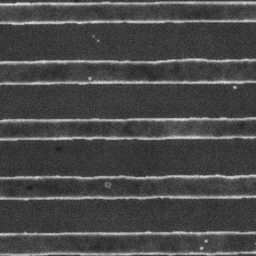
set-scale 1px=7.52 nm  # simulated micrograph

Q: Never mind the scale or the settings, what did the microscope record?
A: lines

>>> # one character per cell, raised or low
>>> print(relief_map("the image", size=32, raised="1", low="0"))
00001111000111111111111111111111
11111111111111111111111111111111
11111111111111111111111111111111
00000000000000000000000000000000
00000000000000000000000000000000
00000000000000000000000000000000
00000000000000000000000000000000
00000000000000000000001111000011
11111111111111111111111111111111
11111111111111111111111111111111
00000000000000000000000000000000
00000000000000000000000000000000
00000000000000000000000000000000
00000000000000000000000000000000
00000000000000000000000000000000
11111111111111111111111111111111
11111111111111111111111111111111
00000000000000000000000000000000
00000000000000000000000000000000
00000000000000000000000000000000
00000000000000000000000000000000
00000000000000000000000000000000
11111111111111111111111111111111
11111111111111111111111111111111
11111111111111111111111111111111
00000000000000000000000000000000
00000000000000000000000000000000
00000000000000000000000000000000
00000000000000000000000000000000
11111111111111111111111111111111
11111111111111111111111111111111
11111111111111111111111111111111